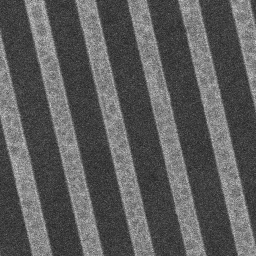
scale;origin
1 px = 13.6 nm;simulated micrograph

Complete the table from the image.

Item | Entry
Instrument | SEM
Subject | parallel lines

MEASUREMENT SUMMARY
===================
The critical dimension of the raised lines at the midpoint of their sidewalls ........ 0.225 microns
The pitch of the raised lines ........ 678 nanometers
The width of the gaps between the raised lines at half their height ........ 451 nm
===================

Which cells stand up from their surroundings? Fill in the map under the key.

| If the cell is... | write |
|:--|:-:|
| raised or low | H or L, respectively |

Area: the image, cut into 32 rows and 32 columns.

LLLHHLLLLLHHLLLLHHLLLLLHHLLLLHHL
LLLLHHLLLLHHLLLLHHLLLLLHHLLLLHHL
LLLLHHLLLLHHLLLLLHHLLLLHHLLLLHHH
LLLLHHLLLLHHHLLLLHHLLLLHHLLLLLLH
LLLLHHLLLLLHHLLLLHHLLLLLHHLLLLHH
LLLLHHHLLLLHHLLLLHHLLLLLHHLLLLHH
LLLLLHHLLLLHHLLLLLHHLLLLHHLLLLHH
HLLLLHHLLLLHHLLLLLHHLLLLHHLLLLLH
HLLLLHHLLLLLHHLLLLHHLLLLHHHLLLLH
HLLLLHHHLLLLHHLLLLHHLLLLLHHLLLLH
HLLLLLHHLLLLHHLLLLLHHLLLLHHLLLLH
HHLLLLHHLLLLHHLLLLLHHLLLLHHLLLLL
HHLLLLHHLLLLLHHLLLLHHLLLLHHHLLLL
HHLLLLHHLLLLLHHLLLLHHLLLLLHHLLLL
HHLLLLLHHLLLLHHLLLLHHLLLLLHHLLLL
HHHLLLLHHLLLLHHLLLLLHHLLLLHHLLLL
LHHLLLLHHLLLLHHHLLLLHHLLLLHHLLLL
LHHLLLLHHLLLLLHHLLLLHHLLLLLHHLLL
LHHLLLLLHHLLLLHHLLLLHHLLLLLHHLLL
LHHLLLLLHHLLLLHHLLLLLHHLLLLHHLLL
LLHHLLLLHHLLLLHHLLLLLHHLLLLHHLLL
LLHHLLLLHHLLLLLHHLLLLHHLLLLLHHLL
LLHHLLLLHHHLLLLHHLLLLHHLLLLLHHLL
LLHHLLLLLHHLLLLHHLLLLHHHLLLLHHLL
LLLHHLLLLHHLLLLHHLLLLLHHLLLLHHLL
LLLHHLLLLHHLLLLLHHLLLLHHLLLLLHHL
LLLHHLLLLHHLLLLLHHLLLLHHLLLLLHHL
LLLHHLLLLLHHLLLLHHLLLLHHHLLLLHHL
LLLHHHLLLLHLLLLLHHLLLLLHHLLLLHHL
LLLLHHLLLLHHLLLLHHHLLLLHHLLLLHHL
LLLLHHLLLLHHLLLLLHHLLLLHHLLLLLHH
LLLLHHLLLLLHHLLLLHHLLLLHHLLLLLHH